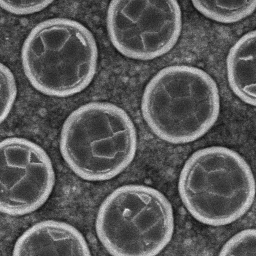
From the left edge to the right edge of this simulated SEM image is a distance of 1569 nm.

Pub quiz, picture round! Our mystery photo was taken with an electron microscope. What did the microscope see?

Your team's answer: raised bodies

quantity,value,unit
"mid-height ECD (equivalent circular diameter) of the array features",443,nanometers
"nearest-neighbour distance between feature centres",0.553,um